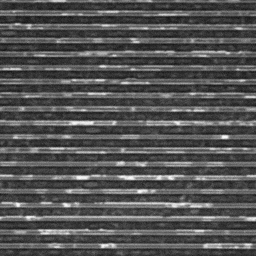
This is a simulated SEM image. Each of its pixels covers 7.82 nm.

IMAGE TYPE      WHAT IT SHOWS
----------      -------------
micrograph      parallel lines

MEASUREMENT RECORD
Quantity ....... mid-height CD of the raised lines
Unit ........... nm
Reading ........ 38.1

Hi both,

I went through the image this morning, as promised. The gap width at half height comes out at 8.87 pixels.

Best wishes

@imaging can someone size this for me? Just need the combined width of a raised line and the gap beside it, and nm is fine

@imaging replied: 107